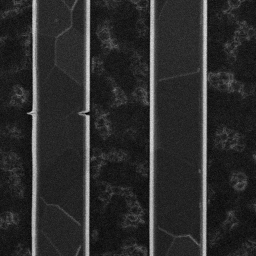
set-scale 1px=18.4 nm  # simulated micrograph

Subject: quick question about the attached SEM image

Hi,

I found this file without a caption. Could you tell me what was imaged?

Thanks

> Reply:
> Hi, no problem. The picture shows one or a few lines or trenches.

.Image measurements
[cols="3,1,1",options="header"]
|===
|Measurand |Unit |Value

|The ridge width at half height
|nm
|993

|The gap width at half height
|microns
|1.17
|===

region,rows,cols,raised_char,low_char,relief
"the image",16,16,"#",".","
..###.....###...
..###.....###...
..###.....###...
..###.....###...
..###.....###...
..###.....###...
..###.....###...
..###.....###...
..###....####...
..###....####...
..###....####...
..###....####...
..###....####...
..###....####...
..###....####...
..###....####...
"